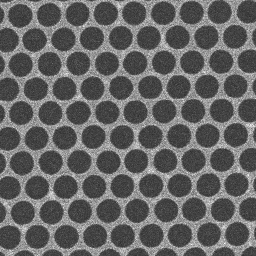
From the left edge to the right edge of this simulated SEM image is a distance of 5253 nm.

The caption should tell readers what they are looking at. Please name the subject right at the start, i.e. a regular array of holes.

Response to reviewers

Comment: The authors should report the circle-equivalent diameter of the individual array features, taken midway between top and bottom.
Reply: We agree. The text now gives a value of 504 nm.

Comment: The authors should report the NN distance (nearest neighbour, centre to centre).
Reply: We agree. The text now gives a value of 574 nm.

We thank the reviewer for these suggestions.